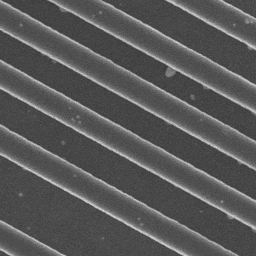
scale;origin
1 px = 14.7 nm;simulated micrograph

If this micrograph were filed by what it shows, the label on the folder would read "lines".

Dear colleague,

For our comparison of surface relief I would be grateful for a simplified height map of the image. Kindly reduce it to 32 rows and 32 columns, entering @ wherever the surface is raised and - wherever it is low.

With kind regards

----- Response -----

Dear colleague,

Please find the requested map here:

@------@@@@@@@--------@@@@@@@---
@@@------@@@@@@--------@@@@@@@--
@@@@-------@@@@@@--------@@@@@@@
@@@@@@------@@@@@@@--------@@@@@
--@@@@@@------@@@@@@@--------@@@
---@@@@@@@------@@@@@@@--------@
-----@@@@@@@------@@@@@@--------
-------@@@@@@@------@@@@@@------
@@-------@@@@@@-------@@@@@@----
@@@@-------@@@@@@------@@@@@@@--
@@@@@-------@@@@@@@------@@@@@@@
-@@@@@@-------@@@@@@@------@@@@@
---@@@@@@-------@@@@@@@------@@@
----@@@@@@@-------@@@@@@-------@
------@@@@@@@-------@@@@@@------
--------@@@@@@-------@@@@@@@----
@@--------@@@@@@-------@@@@@@@--
@@@---------@@@@@@-------@@@@@@@
@@@@@--------@@@@@@@-------@@@@@
@@@@@@@--------@@@@@@@-------@@@
--@@@@@@@--------@@@@@@@-------@
----@@@@@@@--------@@@@@@-------
------@@@@@@@--------@@@@@@-----
--------@@@@@@---------@@@@@@---
---------@@@@@@@--------@@@@@@@-
-----------@@@@@@@--------@@@@@@
-------------@@@@@@@--------@@@@
---------------@@@@@@@--------@@
@@---------------@@@@@@---------
@@@@--------------@@@@@@@-------
@@@@@---------------@@@@@@@-----
-@@@@@@---------------@@@@@@@---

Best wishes